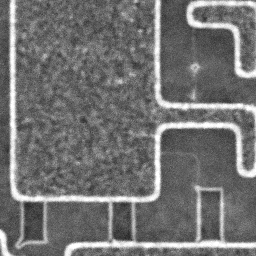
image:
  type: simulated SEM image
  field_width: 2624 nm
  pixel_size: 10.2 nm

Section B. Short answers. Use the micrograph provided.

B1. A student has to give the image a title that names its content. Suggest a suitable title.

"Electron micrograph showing wiring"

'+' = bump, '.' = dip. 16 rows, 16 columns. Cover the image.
.+++++++++..++++
.+++++++++..++++
.+++++++++.....+
.+++++++++.....+
.+++++++++.....+
.+++++++++......
.+++++++++......
.+++++++++++++++
.+++++++++.....+
.+++++++++.....+
.+++++++++.....+
.+++++++++......
................
................
................
.....+++++++++++